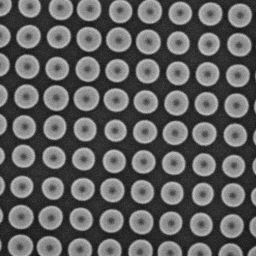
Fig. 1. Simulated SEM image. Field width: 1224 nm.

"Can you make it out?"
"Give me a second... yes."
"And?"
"an array of small figures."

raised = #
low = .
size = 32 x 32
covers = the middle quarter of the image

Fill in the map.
#..######..#####..######..#####.
#..######..#####..######..#####.
#..######..#####..######..#####.
....####...####....####...#####.
....................##.....###..
................................
...#####....##..................
#..######.######..####....####..
#..######.######..#####..######.
#..######.######..#####..######.
...#####...#####..#####..######.
.....#......###...#####...####..
...........................##...
................................
...####....###.....###.....##...
...#####...####...#####..#####..
...#####..######.######..######.
...#####..######.######..######.
....###....####...#####..#####..
...................##.....###...
................................
....###.........................
..#####...#####...####....###...
..######..#####..######..#####..
..######..#####..######..#####..
...####...#####..######..#####..
...........###....####...#####..
...........................#....
................................
...####...####....###...........
..#####..######..#####...####...
..#####..######..#####..######..